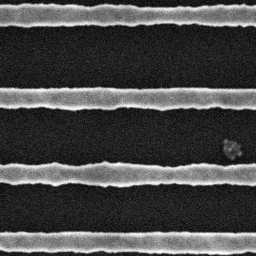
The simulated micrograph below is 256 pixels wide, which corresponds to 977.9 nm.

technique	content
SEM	lines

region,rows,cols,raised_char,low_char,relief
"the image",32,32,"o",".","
................................
oooooooooooooooooooooooooooooooo
oooooooooooooooooooooooooooooooo
................................
................................
................................
................................
................................
................................
................................
................................
oooooooooooooooooooooooooooooooo
oooooooooooooooooooooooooooooooo
.ooo..ooooooooo..ooooooooo..oooo
................................
................................
................................
................................
................................
................................
.oo...oo...oooooo.......oo.....o
oooooooooooooooooooooooooooooooo
oooooooooooooooooooooooooooooooo
................................
................................
................................
................................
................................
................................
oooooooooooooooooooooooooooooooo
oooooooooooooooooooooooooooooooo
.ooo..o..ooo.oo..ooooooooooooooo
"